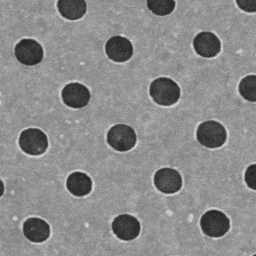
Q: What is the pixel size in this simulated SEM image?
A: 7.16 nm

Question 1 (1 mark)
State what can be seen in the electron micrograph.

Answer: a regular array of holes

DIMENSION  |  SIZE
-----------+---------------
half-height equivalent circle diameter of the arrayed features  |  0.203 microns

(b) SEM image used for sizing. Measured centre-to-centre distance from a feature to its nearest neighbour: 448 nm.